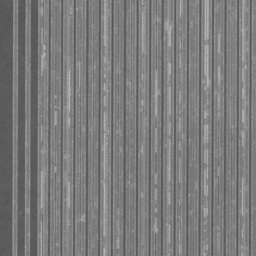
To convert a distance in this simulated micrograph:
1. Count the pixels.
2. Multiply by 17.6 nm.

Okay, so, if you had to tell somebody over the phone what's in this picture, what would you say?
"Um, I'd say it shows parallel lines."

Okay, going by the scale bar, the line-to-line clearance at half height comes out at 0.0528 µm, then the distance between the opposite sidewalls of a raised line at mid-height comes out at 79.2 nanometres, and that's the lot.